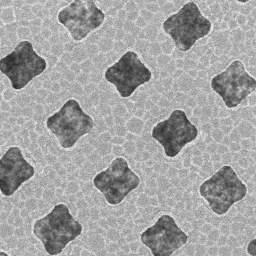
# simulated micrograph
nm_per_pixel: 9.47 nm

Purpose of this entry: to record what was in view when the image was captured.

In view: holes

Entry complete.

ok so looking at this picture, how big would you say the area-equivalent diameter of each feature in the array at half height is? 400 nanometers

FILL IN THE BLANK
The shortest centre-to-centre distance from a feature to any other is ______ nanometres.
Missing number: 709